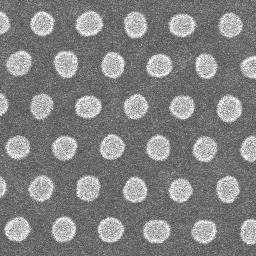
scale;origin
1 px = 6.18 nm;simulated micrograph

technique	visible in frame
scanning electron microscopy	a regular array of raised bodies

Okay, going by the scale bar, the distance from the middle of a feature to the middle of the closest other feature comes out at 287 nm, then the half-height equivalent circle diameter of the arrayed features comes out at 148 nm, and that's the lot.